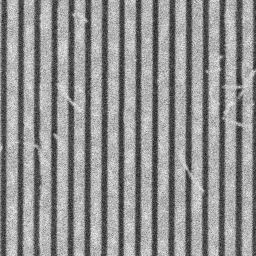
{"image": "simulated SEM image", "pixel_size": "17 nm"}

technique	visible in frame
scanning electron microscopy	parallel lines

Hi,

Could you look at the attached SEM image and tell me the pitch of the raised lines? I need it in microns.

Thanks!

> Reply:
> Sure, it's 0.285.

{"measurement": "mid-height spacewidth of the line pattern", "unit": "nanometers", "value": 117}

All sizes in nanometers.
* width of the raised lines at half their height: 168